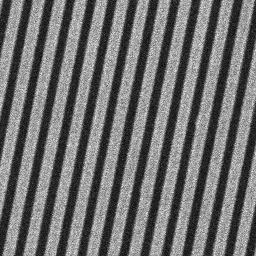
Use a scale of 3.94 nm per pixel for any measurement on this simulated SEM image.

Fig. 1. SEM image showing parallel lines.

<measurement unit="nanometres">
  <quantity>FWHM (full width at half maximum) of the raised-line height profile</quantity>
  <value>42.9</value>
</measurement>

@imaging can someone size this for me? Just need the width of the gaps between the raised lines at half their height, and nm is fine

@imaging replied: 35.7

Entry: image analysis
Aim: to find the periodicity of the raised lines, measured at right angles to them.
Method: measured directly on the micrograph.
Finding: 81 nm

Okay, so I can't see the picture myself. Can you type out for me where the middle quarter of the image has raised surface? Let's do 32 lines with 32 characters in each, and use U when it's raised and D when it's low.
UUDDDUUDDDUUUDDUUUDDDUUDDDUUUDDU
UUDDDUUDDDUUUDDUUUDDUUUDDUUUDDDU
UUDDUUUDDDUUDDDUUUDDUUUDDUUUDDDU
UUDDUUUDDDUUDDDUUUDDUUUDDUUUDDUU
UUDDUUUDDUUUDDUUUDDDUUDDDUUUDDUU
UDDDUUDDDUUUDDUUUDDDUUDDDUUUDDUU
UDDDUUDDDUUUDDUUUDDUUUDDUUUDDDUU
UDDUUUDDDUUDDDUUUDDUUUDDUUUDDDUU
UDDUUUDDUUUDDDUUDDDUUUDDUUUDDUUU
UDDUUUDDUUUDDUUUDDDUUDDDUUUDDUUU
DDDUUDDDUUUDDUUUDDDUUDDDUUUDDUUU
DDDUUDDDUUUDDUUUDDUUUDDUUUDDDUUU
DDUUUDDDUUDDDUUUDDUUUDDUUUDDDUUD
DDUUUDDUUUDDDUUDDDUUUDDUUUDDUUUD
DDUUUDDUUUDDUUUDDDUUDDDUUUDDUUUD
DDUUDDDUUUDDUUUDDUUUDDDUUDDDUUUD
DDUUDDDUUUDDUUUDDUUUDDUUUDDDUUUD
DUUUDDDUUDDDUUUDDUUUDDUUUDDDUUDD
DUUUDDUUUDDDUUDDDUUUDDUUUDDUUUDD
DUUUDDUUUDDUUUDDDUUDDDUUUDDUUUDD
DUUDDDUUUDDUUUDDUUUDDDUUDDDUUUDD
DUUDDDUUUDDUUUDDUUUDDUUUDDDUUUDD
UUUDDDUUDDDUUUDDUUUDDUUUDDUUUDDD
UUUDDUUUDDDUUDDDUUUDDUUUDDUUUDDD
UUUDDUUUDDUUUDDDUUDDDUUUDDUUUDDU
UUDDDUUUDDUUUDDUUUDDDUUDDDUUUDDU
UUDDDUUUDDUUUDDUUUDDUUUDDDUUUDDU
UUDDDUUDDDUUUDDUUUDDUUUDDUUUDDDU
UUDDUUUDDDUUDDDUUUDDUUUDDUUUDDDU
UUDDUUUDDUUUDDDUUDDDUUUDDUUUDDUU
UDDDUUUDDUUUDDUUUDDUUUDDDUUUDDUU
UDDDUUUDDUUUDDUUUDDUUUDDDUUUDDUU